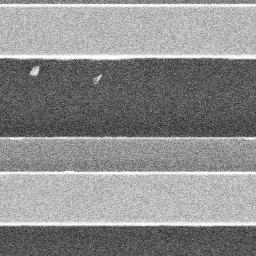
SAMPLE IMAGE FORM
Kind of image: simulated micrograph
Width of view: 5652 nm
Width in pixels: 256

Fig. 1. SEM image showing lines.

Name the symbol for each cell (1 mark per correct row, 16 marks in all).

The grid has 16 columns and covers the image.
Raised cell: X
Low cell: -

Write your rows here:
XXXXXXXXXXXXXXXX
XXXXXXXXXXXXXXXX
XXXXXXXXXXXXXXXX
XXXXXXXXXXXXXXXX
----------------
----------------
----------------
----------------
----------------
XXXXXXXXXXXXXXXX
XXXXXXXXXXXXXXXX
XXXXXXXXXXXXXXXX
XXXXXXXXXXXXXXXX
XXXXXXXXXXXXXXXX
----------------
----------------